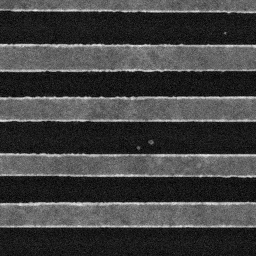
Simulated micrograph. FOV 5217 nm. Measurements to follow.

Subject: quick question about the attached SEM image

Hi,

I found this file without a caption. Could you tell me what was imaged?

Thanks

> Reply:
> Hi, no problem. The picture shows lines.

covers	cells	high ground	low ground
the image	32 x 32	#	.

################################
............................####
................................
................................
................................
................................
################################
################################
################################
................................
................................
................................
################################
################################
################################
................................
................................
................................
................................
################################
################################
################################
................................
................................
................................
################################
################################
################################
................................
................................
................................
................................